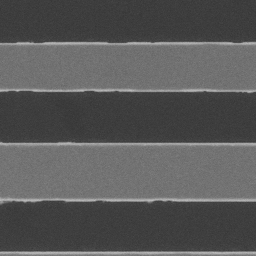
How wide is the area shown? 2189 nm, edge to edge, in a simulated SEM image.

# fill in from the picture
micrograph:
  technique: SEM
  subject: lines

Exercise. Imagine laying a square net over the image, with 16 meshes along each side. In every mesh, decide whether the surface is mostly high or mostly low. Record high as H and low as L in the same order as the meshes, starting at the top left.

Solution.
LLLLLLLLLLLLLLLL
LLLLLLLLLLLLLLLL
LLLLLLLLLLLLLLLL
HHHHHHHHHHHHHHHH
HHHHHHHHHHHHHHHH
HHHHHHHHHHHHHHHH
LLLLLLLLLLLLLLLL
LLLLLLLLLLLLLLLL
LLLLLLLLLLLLLLLL
HHHHHHHHHHHHHHHH
HHHHHHHHHHHHHHHH
HHHHHHHHHHHHHHHH
LHHLHHHHHHHHHHHH
LLLLLLLLLLLLLLLL
LLLLLLLLLLLLLLLL
LLLLLLLLLLLLLLLL